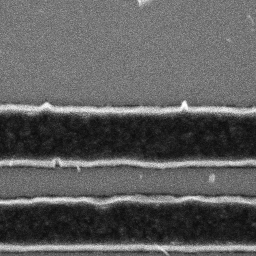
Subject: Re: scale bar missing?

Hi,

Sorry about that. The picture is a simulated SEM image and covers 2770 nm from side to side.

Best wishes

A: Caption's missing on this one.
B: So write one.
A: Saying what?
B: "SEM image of one or a few lines or trenches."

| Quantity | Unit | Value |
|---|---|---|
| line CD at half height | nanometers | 561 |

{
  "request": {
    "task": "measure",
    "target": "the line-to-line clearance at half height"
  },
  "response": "35.1 pixels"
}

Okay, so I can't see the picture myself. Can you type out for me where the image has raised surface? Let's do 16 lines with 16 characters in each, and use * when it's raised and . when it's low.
................
................
................
................
................
................
................
****************
****************
****************
................
................
..****.**.*****.
****************
****************
***.......******